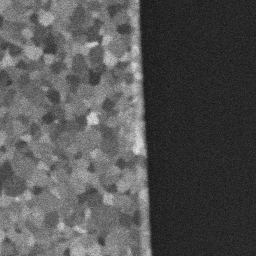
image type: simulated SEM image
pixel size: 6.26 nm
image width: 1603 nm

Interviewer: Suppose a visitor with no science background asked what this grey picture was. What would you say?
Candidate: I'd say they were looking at one or a few lines or trenches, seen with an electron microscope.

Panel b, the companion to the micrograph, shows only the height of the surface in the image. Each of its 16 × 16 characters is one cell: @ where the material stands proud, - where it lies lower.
@@@@@@@@--------
@@@@@@@@--------
@@@@@@@@--------
@@@@@@@@--------
@@@@@@@@@-------
@@@@@@@@@-------
@@@@@@@@@-------
@@@@@@@@@-------
@@@@@@@@@-------
@@@@@@@@@-------
@@@@@@@@@-------
@@@@@@@@@-------
@@@@@@@@@-------
@@@@@@@@@-------
@@@@@@@@@-------
@@@@@@@@@-------